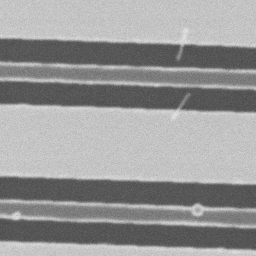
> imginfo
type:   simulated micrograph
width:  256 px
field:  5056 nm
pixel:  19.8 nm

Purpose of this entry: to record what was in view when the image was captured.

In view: lines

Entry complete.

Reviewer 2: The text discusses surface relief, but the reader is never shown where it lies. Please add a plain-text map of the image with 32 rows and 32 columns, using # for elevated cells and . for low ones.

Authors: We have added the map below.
################################
################################
################################
################################
################################
......................#.########
................................
................................
#####################...........
################################
..............##################
................................
................................
############....................
################################
################################
################################
################################
################################
################################
################################
################################
.................###############
................................
................................
#############...................
################################
......##########################
................................
................................
######..........................
################################